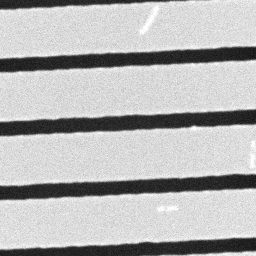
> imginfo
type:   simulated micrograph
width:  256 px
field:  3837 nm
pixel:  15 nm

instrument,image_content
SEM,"lines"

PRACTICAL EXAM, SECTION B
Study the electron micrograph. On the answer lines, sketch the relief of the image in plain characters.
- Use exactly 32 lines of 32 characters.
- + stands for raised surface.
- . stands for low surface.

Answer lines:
................++++++++++++++++
++++++++++++++++++++++++++++++++
++++++++++++++++++++++++++++++++
++++++++++++++++++++++++++++++++
++++++++++++++++++++++++++++++++
++++++++++++++++++++++++++++++++
+++++++++++++++++...............
................................
..............++++++++++++++++++
++++++++++++++++++++++++++++++++
++++++++++++++++++++++++++++++++
++++++++++++++++++++++++++++++++
++++++++++++++++++++++++++++++++
++++++++++++++++++++++++++++++++
++++++++++++++..................
................................
...............+++++++++++++++++
++++++++++++++++++++++++++++++++
++++++++++++++++++++++++++++++++
++++++++++++++++++++++++++++++++
++++++++++++++++++++++++++++++++
++++++++++++++++++++++++++++++++
++++++++++++++..................
................................
.............+++++++++++++++++++
++++++++++++++++++++++++++++++++
++++++++++++++++++++++++++++++++
++++++++++++++++++++++++++++++++
++++++++++++++++++++++++++++++++
++++++++++++++++++++++++++++++++
+++++++++++++++.................
................................